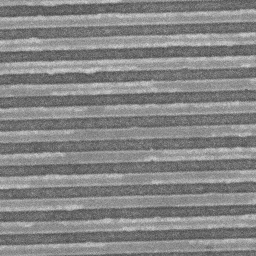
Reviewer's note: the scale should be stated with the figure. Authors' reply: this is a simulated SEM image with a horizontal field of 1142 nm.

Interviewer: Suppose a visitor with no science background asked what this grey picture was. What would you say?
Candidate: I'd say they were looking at parallel lines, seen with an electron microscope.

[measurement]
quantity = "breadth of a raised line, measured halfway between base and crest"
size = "49.6 nanometres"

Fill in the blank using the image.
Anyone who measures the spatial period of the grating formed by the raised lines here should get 102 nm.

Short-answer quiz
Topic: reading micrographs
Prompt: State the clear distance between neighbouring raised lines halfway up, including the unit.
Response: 12.1 pixels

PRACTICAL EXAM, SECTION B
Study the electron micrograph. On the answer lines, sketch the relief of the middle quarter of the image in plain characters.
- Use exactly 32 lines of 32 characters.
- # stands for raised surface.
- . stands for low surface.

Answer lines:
################################
###############.................
................................
................................
..................##.#####....##
################################
################################
#.######........................
................................
................................
.............###################
################################
############################....
................................
................................
................................
.........#######################
################################
#####################...........
................................
................................
.....................##........#
################################
################################
###########.....................
................................
................................
......................##########
################################
################################
................................
................................